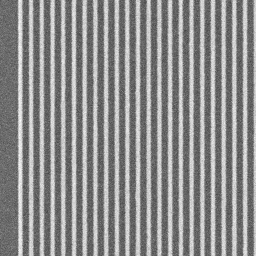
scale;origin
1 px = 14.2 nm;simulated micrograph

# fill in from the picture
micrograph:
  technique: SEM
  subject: parallel lines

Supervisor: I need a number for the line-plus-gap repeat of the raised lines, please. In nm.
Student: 152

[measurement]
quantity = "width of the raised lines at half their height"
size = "37.3 nanometres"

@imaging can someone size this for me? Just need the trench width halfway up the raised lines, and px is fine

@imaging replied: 7.87